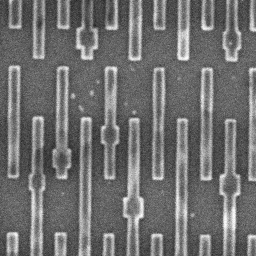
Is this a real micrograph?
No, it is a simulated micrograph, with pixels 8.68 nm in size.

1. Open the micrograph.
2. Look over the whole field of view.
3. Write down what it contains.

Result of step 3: wiring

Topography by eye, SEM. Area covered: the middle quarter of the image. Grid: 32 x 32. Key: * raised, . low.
................................
*.........***..........**.......
*.........***.........***.......
*.........***.........***.......
*.........***.........***.......
*.........***.........***.......
*.........***.........***.......
*.........***.........***.......
*.........***.........***.......
*.........***.........***.......
*.........***.........***.......
*.........***.........***.......
*.........***.........***.......
*.........***.........***.......
*...***...***...***...***....**.
*...***...***...***...***....**.
*...***..*****..***...***....**.
*...***..*****..***...***....**.
*...***..*****..***...***....**.
*...***..*****..***...***....**.
*...***...***...***...***...***.
*...***...***...***...***...***.
**..***...***...***...***...***.
**..***...***...***...***...***.
**..***...***...***...***...***.
**..***...***...***...***...***.
*...**....***...***...***...***.
*...**....***...***...***...***.
....**....***...***...***...***.
....**..........***.........***.
....**..........***.........***.
....**..........***.........***.